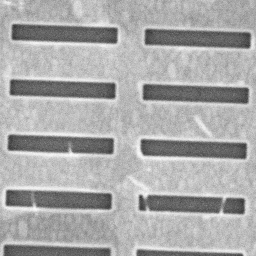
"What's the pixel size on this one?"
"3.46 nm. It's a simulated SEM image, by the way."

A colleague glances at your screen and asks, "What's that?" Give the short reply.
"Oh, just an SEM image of groups of lines, slits or small figures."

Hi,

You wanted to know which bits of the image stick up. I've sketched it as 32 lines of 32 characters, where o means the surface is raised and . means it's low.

oooooooooooooooooooooooooooooooo
oooooooooooooooooooooooooooooooo
oooooooooooooooooooooooooooooooo
o.............oooooooooooooooooo
o..............ooo.............o
oooooooooooo..oooo..............
oooooooooooooooooooooooooooooooo
oooooooooooooooooooooooooooooooo
oooooooooooooooooooooooooooooooo
oooooooooooooooooooooooooooooooo
o.............oooo...ooooooooooo
o..............ooo.............o
ooooooooooo...oooo.............o
oooooooooooooooooooooooooooooooo
oooooooooooooooooooooooooooooooo
oooooooooooooooooooooooooooooooo
oooooooooooooooooooooooooooooooo
o.............oooo......oooooooo
o.............ooo..............o
oooooooooooooooooo.............o
oooooooooooooooooooooooooooooooo
oooooooooooooooooooooooooooooooo
oooooooooooooooooooooooooooooooo
o...oooooooooooooooooooooooooooo
o.............oooo.........ooooo
o.............ooo..............o
ooooooooooooooooooo............o
oooooooooooooooooooooooooooooooo
oooooooooooooooooooooooooooooooo
oooooooooooooooooooooooooooooooo
o......ooooooooooooooooooooooooo
..............ooo.............oo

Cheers